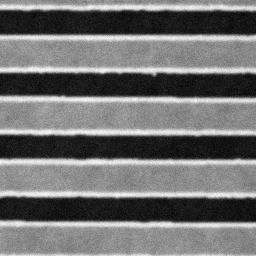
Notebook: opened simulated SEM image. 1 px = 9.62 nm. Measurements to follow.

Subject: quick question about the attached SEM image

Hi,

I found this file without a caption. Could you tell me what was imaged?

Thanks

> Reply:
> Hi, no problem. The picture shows lines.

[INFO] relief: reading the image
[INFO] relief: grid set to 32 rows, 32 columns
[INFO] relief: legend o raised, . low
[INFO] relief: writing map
oooooooooooooooooooooooooooooooo
................................
................................
................................
..oo............................
oooooooooooooooooooooooooooooooo
oooooooooooooooooooooooooooooooo
oooooooooooooooooooooooooooooooo
oooooooooooooooooooooooooooooooo
................................
................................
................................
oooooooooooooooooooooooooooooooo
oooooooooooooooooooooooooooooooo
oooooooooooooooooooooooooooooooo
oooooooooooooooooooooooooooooooo
oooooooooooooooooooooooooooooooo
................................
................................
................................
oooooooooooooooooooooooooooooooo
oooooooooooooooooooooooooooooooo
oooooooooooooooooooooooooooooooo
oooooooooooooooooooooooooooooooo
..............o.....ooo...oooooo
................................
................................
................................
oooooooooooooooooooooooooooooooo
oooooooooooooooooooooooooooooooo
oooooooooooooooooooooooooooooooo
oooooooooooooooooooooooooooooooo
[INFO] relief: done